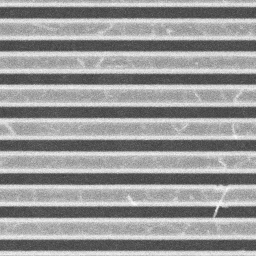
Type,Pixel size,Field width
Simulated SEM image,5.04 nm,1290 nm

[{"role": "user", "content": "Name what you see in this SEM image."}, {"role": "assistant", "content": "parallel lines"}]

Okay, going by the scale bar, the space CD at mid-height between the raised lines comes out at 78.2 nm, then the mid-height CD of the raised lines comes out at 92.7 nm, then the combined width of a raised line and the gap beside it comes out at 168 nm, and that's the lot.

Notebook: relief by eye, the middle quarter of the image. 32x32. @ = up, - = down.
@@@@@@@@@@@@@@@@@@@@@@@@@@@@@@@@
@@@@@@@@@@@@@@@@@@@@@@@@@@@@@@@@
--------------------------------
--------------------------------
--------------------------------
--------------------------------
@@@@@@@@@@@@@@@@@@@@@@@@@@@@@@@@
@@@@@@@@@@@@@@@@@@@@@@@@@@@@@@@@
@@@@@@@@@@@@@@@@@@@@@@@@@@@@@@@@
@@@@@@@@@@@@@@@@@@@@@@@@@@@@@@@@
--------------------------------
--------------------------------
--------------------------------
--------------------------------
@@@@@@@@@@@@@@@@@@@@@@@@@@@@@@@@
@@@@@@@@@@@@@@@@@@@@@@@@@@@@@@@@
@@@@@@@@@@@@@@@@@@@@@@@@@@@@@@@@
@@@@@@@@@@@@@@@@@@@@@@@@@@@@@@@@
--------------------------------
--------------------------------
--------------------------------
--------------------------------
@@@@@@@@@@@@@@@@@@@@@@@@@@@@@@@@
@@@@@@@@@@@@@@@@@@@@@@@@@@@@@@@@
@@@@@@@@@@@@@@@@@@@@@@@@@@@@@@@@
@@@@@@@@@@@@@@@@@@@@@@@@@@@@@@@@
@@@@@@@@@@@@@@@@@@@@@@@@@@@@@@@@
--------------------------------
--------------------------------
--------------------------------
--------------------------------
@@@@@@@@@@@@@@@@@@@@@@@@@@@@@@@@